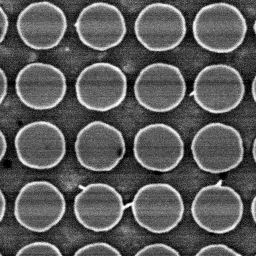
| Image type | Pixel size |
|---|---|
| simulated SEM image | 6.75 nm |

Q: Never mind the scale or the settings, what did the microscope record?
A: a regular array of raised bodies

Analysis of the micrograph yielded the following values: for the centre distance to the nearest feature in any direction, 400 nm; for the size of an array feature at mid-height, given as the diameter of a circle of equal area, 327 nm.